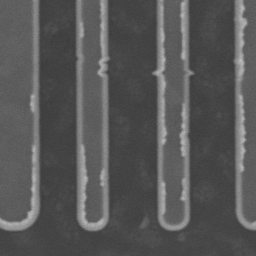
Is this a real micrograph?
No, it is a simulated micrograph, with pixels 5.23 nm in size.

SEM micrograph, one or a few lines or trenches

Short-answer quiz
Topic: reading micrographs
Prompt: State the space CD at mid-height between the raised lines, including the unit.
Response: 263 nanometres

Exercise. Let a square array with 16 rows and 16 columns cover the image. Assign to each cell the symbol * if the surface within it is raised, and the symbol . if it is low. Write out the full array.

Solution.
**...**...**...*
**...**...**...*
**...**...**...*
**...**...**...*
**...**...**...*
**...**...**...*
**...**...**...*
**...**...**...*
**...**...**...*
**...**...**...*
**...**...**...*
**...**...**...*
**...**...**...*
**...**...**...*
................
................